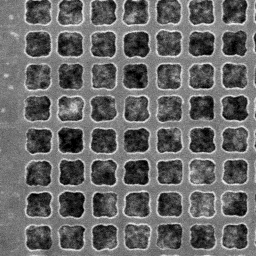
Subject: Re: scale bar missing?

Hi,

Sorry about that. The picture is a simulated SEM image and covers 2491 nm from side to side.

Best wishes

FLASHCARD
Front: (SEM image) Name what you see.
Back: a regular array of holes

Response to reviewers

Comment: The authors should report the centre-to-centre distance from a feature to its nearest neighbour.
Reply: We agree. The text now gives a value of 309 nm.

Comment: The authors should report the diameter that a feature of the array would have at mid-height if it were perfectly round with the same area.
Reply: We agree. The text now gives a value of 265 nanometers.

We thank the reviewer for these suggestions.